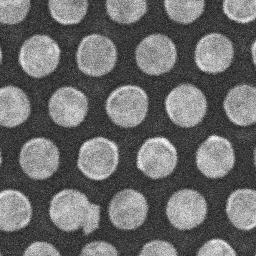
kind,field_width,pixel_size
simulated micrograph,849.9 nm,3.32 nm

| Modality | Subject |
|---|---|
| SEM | a regular array of raised bodies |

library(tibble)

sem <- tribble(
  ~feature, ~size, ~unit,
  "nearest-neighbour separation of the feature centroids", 58.3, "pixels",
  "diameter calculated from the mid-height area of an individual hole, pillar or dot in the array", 133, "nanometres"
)